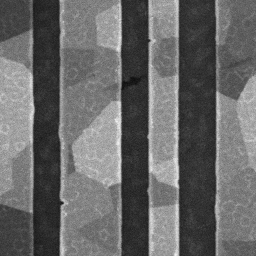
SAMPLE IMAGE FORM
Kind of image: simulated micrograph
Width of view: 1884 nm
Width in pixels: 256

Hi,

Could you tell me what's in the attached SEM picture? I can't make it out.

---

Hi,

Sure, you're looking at one or a few lines or trenches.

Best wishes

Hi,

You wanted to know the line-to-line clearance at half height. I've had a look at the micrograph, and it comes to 0.217 µm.